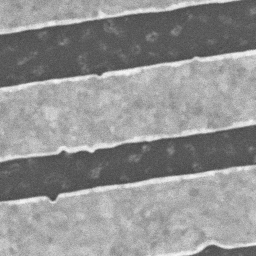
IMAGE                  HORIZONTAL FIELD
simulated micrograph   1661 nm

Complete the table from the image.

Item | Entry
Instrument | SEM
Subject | one or a few lines or trenches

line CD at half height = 469 nm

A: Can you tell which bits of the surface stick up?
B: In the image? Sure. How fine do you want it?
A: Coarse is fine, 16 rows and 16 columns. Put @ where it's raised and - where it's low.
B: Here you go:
@@@@@@@@@@@-----
@@@@------------
----------------
--------------@@
-------@@@@@@@@@
@@@@@@@@@@@@@@@@
@@@@@@@@@@@@@@@@
@@@@@@@@@@@@@@@@
@@@@@@@@@@@-----
@@@@------------
---------------@
--------@@@@@@@@
-@@@@@@@@@@@@@@@
@@@@@@@@@@@@@@@@
@@@@@@@@@@@@@@@@
@@@@@@@@@@@@@---